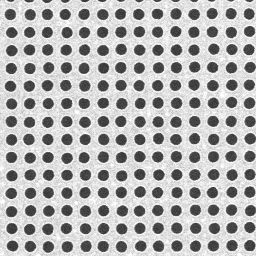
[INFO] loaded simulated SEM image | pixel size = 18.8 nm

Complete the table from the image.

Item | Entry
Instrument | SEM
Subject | a regular array of holes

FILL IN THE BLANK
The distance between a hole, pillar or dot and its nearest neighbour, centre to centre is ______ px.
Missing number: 17.4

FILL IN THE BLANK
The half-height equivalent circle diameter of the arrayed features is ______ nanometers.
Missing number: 215